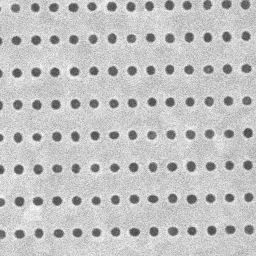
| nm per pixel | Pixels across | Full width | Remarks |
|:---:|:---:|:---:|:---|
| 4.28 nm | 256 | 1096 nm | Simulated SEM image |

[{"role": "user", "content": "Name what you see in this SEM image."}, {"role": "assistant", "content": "a regular array of holes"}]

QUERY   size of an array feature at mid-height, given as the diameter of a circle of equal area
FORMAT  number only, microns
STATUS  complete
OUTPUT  0.0443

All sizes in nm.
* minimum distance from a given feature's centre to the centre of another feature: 80.5